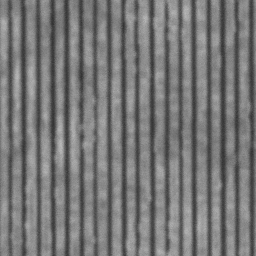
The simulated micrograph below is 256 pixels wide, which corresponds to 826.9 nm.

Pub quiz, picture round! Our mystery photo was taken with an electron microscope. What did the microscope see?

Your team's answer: parallel lines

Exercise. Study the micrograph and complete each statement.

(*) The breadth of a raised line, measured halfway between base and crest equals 30.7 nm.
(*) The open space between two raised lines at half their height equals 14.2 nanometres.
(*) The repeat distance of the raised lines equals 46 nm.